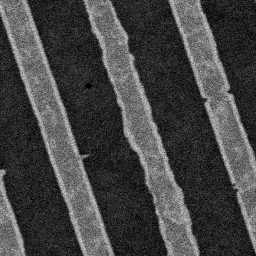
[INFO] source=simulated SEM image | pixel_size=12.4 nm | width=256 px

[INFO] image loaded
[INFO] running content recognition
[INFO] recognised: one or a few lines or trenches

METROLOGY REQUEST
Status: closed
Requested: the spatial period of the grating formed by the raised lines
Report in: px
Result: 81.8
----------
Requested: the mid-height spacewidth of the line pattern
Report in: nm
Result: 713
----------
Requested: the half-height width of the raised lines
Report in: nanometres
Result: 305